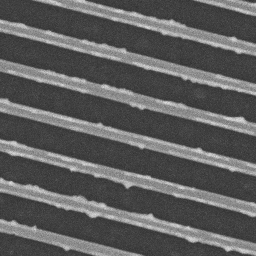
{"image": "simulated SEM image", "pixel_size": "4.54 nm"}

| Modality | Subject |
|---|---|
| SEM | parallel lines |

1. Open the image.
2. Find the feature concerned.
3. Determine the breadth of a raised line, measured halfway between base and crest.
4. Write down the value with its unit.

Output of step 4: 52.8 nm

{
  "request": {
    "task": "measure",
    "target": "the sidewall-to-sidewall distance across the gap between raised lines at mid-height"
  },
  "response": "123 nm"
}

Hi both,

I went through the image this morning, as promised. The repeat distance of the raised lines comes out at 0.176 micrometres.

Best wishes